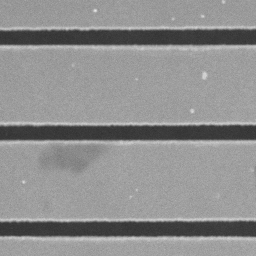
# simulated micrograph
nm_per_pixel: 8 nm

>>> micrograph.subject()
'lines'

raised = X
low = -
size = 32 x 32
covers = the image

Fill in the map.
XXXXXXXXXXXXXXXXXXXXXXXXXXXXXXXX
XXXXXXXXXXXXXXXXXXXXXXXXXXXXXXXX
XXXXXXXXXXXXXXXXXXXXXXXXXXXXXXXX
XXXXXXXXXXXXXXXXXXXXXXXXXXXXXXXX
--------------------------------
--------------------------------
XXXXXXXXXXXXXXXXXXXXXXXXXXXXXXXX
XXXXXXXXXXXXXXXXXXXXXXXXXXXXXXXX
XXXXXXXXXXXXXXXXXXXXXXXXXXXXXXXX
XXXXXXXXXXXXXXXXXXXXXXXXXXXXXXXX
XXXXXXXXXXXXXXXXXXXXXXXXXXXXXXXX
XXXXXXXXXXXXXXXXXXXXXXXXXXXXXXXX
XXXXXXXXXXXXXXXXXXXXXXXXXXXXXXXX
XXXXXXXXXXXXXXXXXXXXXXXXXXXXXXXX
XXXXXXXXXXXXXXXXXXXXXXXXXXXXXXXX
XXXXXXXXXXXXXXXXXXXXXXXXXXXXXXXX
--------------------------------
--------------------------------
XXXXXXXXXXXXXXXXXXXXXXXXXXXXXXXX
XXXXXXXXXXXXXXXXXXXXXXXXXXXXXXXX
XXXXXXXXXXXXXXXXXXXXXXXXXXXXXXXX
XXXXXXXXXXXXXXXXXXXXXXXXXXXXXXXX
XXXXXXXXXXXXXXXXXXXXXXXXXXXXXXXX
XXXXXXXXXXXXXXXXXXXXXXXXXXXXXXXX
XXXXXXXXXXXXXXXXXXXXXXXXXXXXXXXX
XXXXXXXXXXXXXXXXXXXXXXXXXXXXXXXX
XXXXXXXXXXXXXXXXXXXXXXXXXXXXXXXX
XXXXXXXXXXXXXXXXXXXXXXXXXXXXXXXX
--------------------------------
--------------------------------
XXXXXXXXXXXXXXXXXXXXXXXXXXXXXXXX
XXXXXXXXXXXXXXXXXXXXXXXXXXXXXXXX